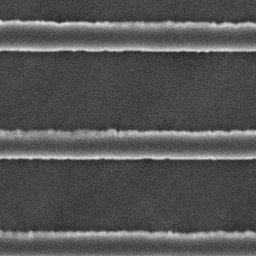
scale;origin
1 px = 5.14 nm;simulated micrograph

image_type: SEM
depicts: lines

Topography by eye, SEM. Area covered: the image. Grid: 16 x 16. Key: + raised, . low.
................
++++++++++++++++
++++++++++++++++
................
................
................
................
................
++++++++++++++++
++++++++++++++++
................
................
................
................
................
++++++++++++++++